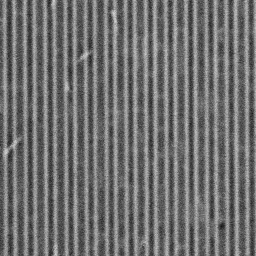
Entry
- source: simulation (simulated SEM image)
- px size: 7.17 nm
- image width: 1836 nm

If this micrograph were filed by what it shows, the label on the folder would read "parallel lines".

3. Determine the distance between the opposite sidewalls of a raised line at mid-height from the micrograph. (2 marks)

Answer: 17.9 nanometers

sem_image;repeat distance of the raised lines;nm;72.2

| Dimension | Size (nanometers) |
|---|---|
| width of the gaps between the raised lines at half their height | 48.4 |